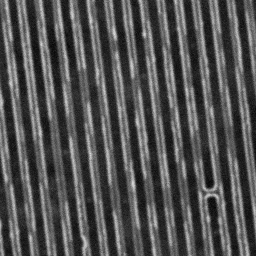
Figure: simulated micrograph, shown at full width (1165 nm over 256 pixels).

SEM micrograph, parallel lines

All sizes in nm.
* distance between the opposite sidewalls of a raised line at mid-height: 34.4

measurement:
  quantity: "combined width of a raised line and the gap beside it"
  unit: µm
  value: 0.0789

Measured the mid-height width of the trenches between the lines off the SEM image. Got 46.2 nm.